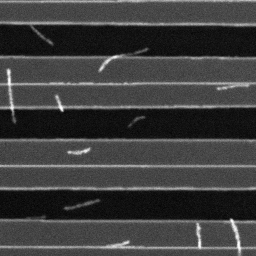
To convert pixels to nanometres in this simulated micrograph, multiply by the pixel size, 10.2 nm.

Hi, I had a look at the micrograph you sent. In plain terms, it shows lines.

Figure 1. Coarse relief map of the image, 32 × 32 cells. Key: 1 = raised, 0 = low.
11111111111111111111111111111111
11111111111111111111111111111111
11111111111111111111111111111111
00000000000000000000000000000000
00000000000000000000000000000000
00000000000000000000000000000000
00000000000000000000000000000000
11111111111111111111111111111111
11111111111111111111111111111111
11111111111111111111111111111111
11111111111111111111111111111111
11111111111111111111111111111111
11111111111111111111111111111111
11111001000000000000000000000000
00000000000000000000000000000000
00000000000000000000000000000000
00000000000000000000000000000000
00000001111000000000000000000000
11111111111111111111111111111111
11111111111111111111111111111111
11111111111111111111111111111111
11111111111111111111111111111111
11111111111111111111111111111111
11111111111111111111111111111111
00000000000000000000000000000000
00000000000000000000000000000000
00000000000000000000000000000000
00000000000000000000000000000000
11111111111111111111111111111111
11111111111111111111111111111111
11111111111111111111111111111111
11111111111111111111111111111111